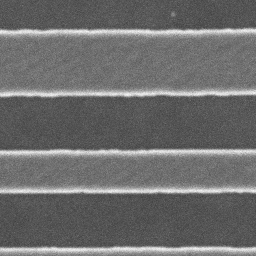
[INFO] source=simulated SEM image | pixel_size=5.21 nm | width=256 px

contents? lines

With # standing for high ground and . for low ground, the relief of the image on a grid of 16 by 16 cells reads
................
................
################
################
################
################
................
................
................
################
################
################
................
................
................
.......###.####.